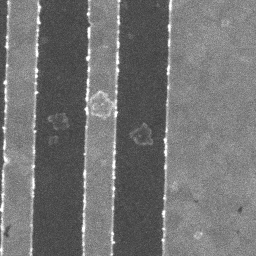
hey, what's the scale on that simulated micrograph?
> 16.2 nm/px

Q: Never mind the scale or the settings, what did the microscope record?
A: one or a few lines or trenches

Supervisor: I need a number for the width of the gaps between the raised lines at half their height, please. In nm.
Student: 812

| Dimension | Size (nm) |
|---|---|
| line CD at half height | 493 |